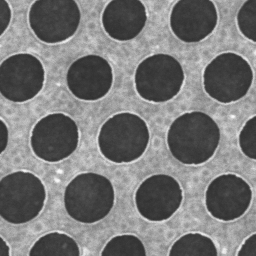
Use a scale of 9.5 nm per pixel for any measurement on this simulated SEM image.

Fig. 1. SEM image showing a regular array of holes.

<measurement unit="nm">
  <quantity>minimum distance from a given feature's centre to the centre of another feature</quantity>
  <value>653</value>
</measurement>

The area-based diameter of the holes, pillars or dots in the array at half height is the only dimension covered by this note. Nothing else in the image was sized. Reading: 0.466 um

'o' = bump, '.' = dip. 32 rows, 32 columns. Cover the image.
.ooo......oooo....oooo.....ooo..
.ooo......ooo.....ooo......ooo..
.ooo......ooo.....ooo......ooo..
.ooo......ooo.....ooo......ooo..
ooooo....ooooo...ooooo....ooooo.
oooooooooooooooooooooooooooooooo
oooooooooooooooooooooooooooooooo
o....ooooo...ooooo....ooooo....o
.....oooo.....ooo......ooo.....o
......oo......ooo......oo.......
.....ooo......ooo......oo......o
.....oooo....oooo.....oooo.....o
o...oooooo..oooooo...oooooo...oo
oooooooooooooooooooooooooooooooo
oooooo..oooooo...ooooo....oooooo
.oooo.....ooo.....ooo......oooo.
.ooo......oo.......oo.......oo..
.ooo......oo.......oo......ooo..
.ooo......oo......ooo......ooo..
ooooo....oooo.....oooo....ooooo.
ooooooooooooooooooooooo..ooooooo
oo.ooooooooooooooooooooooooooooo
.....oooo.....oooo....ooooo...oo
.....ooo......ooo......ooo.....o
......oo......ooo......ooo......
.....ooo......ooo......ooo.....o
.....ooo......ooo.....oooo.....o
o...ooooo...ooooooo.oooooooo.ooo
oooooooooooooooooooooooooooooooo
ooooo....ooooo...oooooo...ooooo.
.ooo......ooo.....oooo.....ooo..
.ooo......ooo.....ooo......ooo..